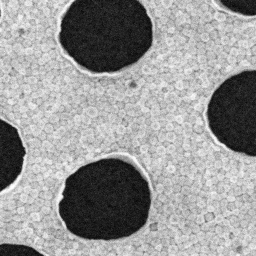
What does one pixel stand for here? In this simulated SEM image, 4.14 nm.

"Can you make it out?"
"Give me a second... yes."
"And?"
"holes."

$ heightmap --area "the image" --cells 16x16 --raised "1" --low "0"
1111000001111100
1111000001111111
1111000001111111
1111000001111111
1111110111111110
1111111111111100
1111111111111000
1111111111111000
0111111111111000
0011111111111110
0111100001111111
0111000001111111
1111000001111111
1111000001111111
1111000011111111
0011111111111111